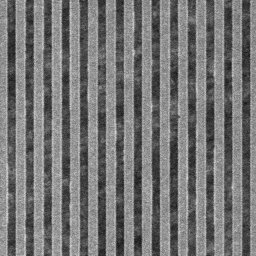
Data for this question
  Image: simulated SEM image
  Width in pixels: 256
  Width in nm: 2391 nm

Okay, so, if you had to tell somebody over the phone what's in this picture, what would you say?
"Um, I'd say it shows parallel lines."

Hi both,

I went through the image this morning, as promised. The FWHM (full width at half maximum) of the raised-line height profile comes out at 79.4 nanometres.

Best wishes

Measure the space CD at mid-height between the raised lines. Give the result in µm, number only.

0.0875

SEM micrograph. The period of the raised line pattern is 168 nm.